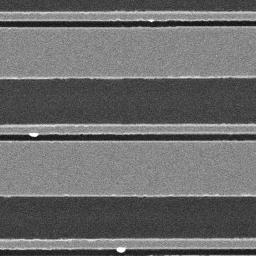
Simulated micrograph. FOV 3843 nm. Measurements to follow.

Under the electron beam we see lines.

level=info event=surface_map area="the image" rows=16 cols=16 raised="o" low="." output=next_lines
................
oooooooooooooooo
oooooooooooooooo
oooooooooooooooo
oooooooooooooooo
................
................
................
oooooooooooooooo
oooooooooooooooo
oooooooooooooooo
oooooooooooooooo
................
................
................
oooooooooooooooo